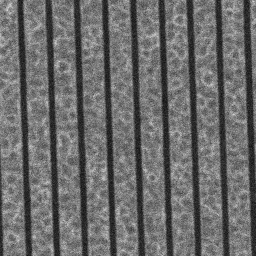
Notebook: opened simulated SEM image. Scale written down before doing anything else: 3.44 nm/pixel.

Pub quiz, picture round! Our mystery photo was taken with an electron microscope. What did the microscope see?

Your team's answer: parallel lines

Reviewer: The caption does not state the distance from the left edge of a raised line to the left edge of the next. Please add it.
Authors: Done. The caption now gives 97.1 nanometres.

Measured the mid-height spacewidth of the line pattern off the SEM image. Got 23.6 nm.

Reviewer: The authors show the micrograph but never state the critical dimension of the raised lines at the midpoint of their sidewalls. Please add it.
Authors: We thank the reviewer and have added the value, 73.4 nm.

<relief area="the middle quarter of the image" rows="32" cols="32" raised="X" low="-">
XXX--XXXXX--XXXXX--XXXXX--XXXXX-
XXX--XXXXX--XXXXX--XXXXX--XXXXX-
XXX--XXXXX--XXXXX--XXXXX--XXXXX-
XXX--XXXXX--XXXXX--XXXXX--XXXXX-
XXX--XXXXX--XXXXX--XXXXX--XXXXX-
XXX--XXXXX--XXXXX--XXXXX--XXXXX-
XXX--XXXXX--XXXXX--XXXXX--XXXXX-
XXX--XXXXX--XXXXX--XXXXX--XXXXX-
XXX--XXXXX--XXXXX--XXXXX--XXXXX-
XXX--XXXXX--XXXXX--XXXXX--XXXXX-
XXX--XXXXX--XXXXX--XXXXX--XXXXX-
XXX--XXXXX--XXXXX--XXXXX--XXXXX-
XXX--XXXXX--XXXXX--XXXXX--XXXXX-
XXX--XXXXX--XXXXX--XXXXX--XXXXX-
XXX--XXXXX--XXXXX--XXXXX--XXXXX-
XXX--XXXXX--XXXXX--XXXXX--XXXXXX
XXX--XXXXX--XXXXX--XXXXX--XXXXXX
XXX--XXXXX--XXXXX--XXXXXX-XXXXXX
XXX--XXXXX--XXXXX--XXXXXX-XXXXXX
XXX--XXXXX--XXXXXX-XXXXXX--XXXXX
XXX--XXXXX--XXXXXX-XXXXXX--XXXXX
XXX--XXXXXX-XXXXXX--XXXXX--XXXXX
XXX---XXXXX-XXXXXX--XXXXX--XXXXX
XXXX--XXXXX--XXXXX--XXXXX--XXXXX
XXXX--XXXXX--XXXXX--XXXXX--XXXXX
XXXX--XXXXX--XXXXX--XXXXX--XXXXX
XXXX--XXXXX--XXXXX--XXXXX--XXXXX
XXXX--XXXXX--XXXXX--XXXXX--XXXXX
XXXX--XXXXX--XXXXX--XXXXX--XXXXX
XXXX--XXXXX--XXXXX--XXXXX--XXXXX
XXXX--XXXXX--XXXXX--XXXXX--XXXXX
XXXX--XXXXX--XXXXX--XXXXX--XXXXX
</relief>